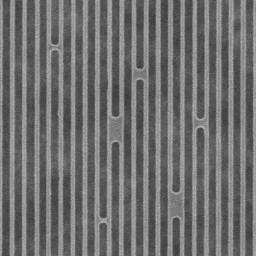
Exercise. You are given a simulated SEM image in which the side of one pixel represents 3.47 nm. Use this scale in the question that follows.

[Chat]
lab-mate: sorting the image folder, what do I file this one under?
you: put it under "parallel lines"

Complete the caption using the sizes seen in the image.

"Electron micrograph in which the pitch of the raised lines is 0.0421 µm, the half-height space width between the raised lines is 29.5 nm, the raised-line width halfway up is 13 nm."